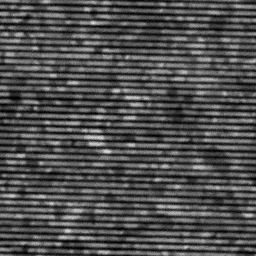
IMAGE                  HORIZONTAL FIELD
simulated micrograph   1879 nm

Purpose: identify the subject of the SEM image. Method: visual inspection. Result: parallel lines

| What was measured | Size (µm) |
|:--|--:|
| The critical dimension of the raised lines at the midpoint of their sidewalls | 0.0248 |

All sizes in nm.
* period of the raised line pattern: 49.4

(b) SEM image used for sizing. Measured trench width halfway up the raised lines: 24.8 nm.